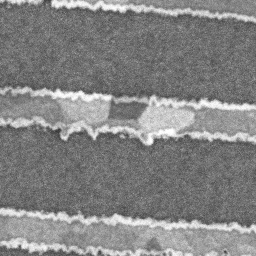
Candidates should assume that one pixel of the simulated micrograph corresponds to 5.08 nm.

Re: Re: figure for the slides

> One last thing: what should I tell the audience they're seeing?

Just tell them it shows one or a few lines or trenches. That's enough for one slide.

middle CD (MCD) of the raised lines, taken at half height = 160 nanometers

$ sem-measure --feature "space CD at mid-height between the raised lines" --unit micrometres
0.457